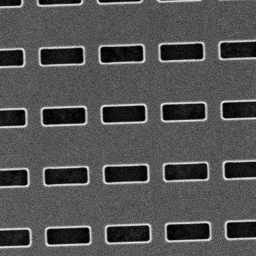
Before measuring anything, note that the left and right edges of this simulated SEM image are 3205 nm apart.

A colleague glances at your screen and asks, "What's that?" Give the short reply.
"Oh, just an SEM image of an array of small figures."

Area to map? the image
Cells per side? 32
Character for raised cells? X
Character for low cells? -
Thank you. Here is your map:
---XX-----XXXXXXXXXXXXXXXXXXXXXX
XXXXXXXXXXXXXXXXXXXXXXXXXXXXXXXX
XXXXXXXXXXXXXXXXXXXXXXXXXXXXXXXX
XXXXXXXXXXXXXXXXXXXXXXXXXXXXXXXX
XXXXXXXXXXXXXXXXXXXXXXXXXXXXXXXX
XXXXXXXXXXXXXXXXXXXXX----XXX----
---XX-----XX------XX-----XX-----
---XX-----XXX-----XX-----XXXXXXX
XXXXXXXXXXXXXXXXXXXXXXXXXXXXXXXX
XXXXXXXXXXXXXXXXXXXXXXXXXXXXXXXX
XXXXXXXXXXXXXXXXXXXXXXXXXXXXXXXX
XXXXXXXXXXXXXXXXXXXXXXXXXXXXXXXX
XXXXXXXXXXXXXXXXXXXXXXXXXXXXXXXX
XXXXXX----XXX-----XX------XX----
---XX------XX-----XX------XX----
---XXX----XXXXXXXXXXXXXXXXXXXXXX
XXXXXXXXXXXXXXXXXXXXXXXXXXXXXXXX
XXXXXXXXXXXXXXXXXXXXXXXXXXXXXXXX
XXXXXXXXXXXXXXXXXXXXXXXXXXXXXXXX
XXXXXXXXXXXXXXXXXXXXXXXXXXXXXXXX
XXXXXXXXXXXXXXXXXXXXX-----XX----
---XXX-----XX------X------XX----
----XX-----XX-----XXX---XXXXXXXX
XXXXXXXXXXXXXXXXXXXXXXXXXXXXXXXX
XXXXXXXXXXXXXXXXXXXXXXXXXXXXXXXX
XXXXXXXXXXXXXXXXXXXXXXXXXXXXXXXX
XXXXXXXXXXXXXXXXXXXXXXXXXXXXXXXX
XXXXXXXXXXXXXXXXXXXXXXXXXXXXXXXX
XXXXXX-----XX------XX-----XX----
----XX-----XX------XX-----XX----
----XX-----XXXXXXXXXXXXXXXXXXXXX
XXXXXXXXXXXXXXXXXXXXXXXXXXXXXXXX